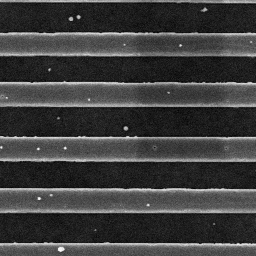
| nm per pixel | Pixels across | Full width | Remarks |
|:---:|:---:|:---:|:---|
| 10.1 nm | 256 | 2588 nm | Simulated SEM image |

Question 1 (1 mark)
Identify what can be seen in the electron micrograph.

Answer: lines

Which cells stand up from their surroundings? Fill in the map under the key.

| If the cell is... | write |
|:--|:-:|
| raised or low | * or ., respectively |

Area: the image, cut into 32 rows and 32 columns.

................................
................................
................................
................................
********************************
********************************
********************************
................................
................................
................................
********************************
********************************
********************************
................................
................................
................................
................................
********************************
********************************
********************************
................................
................................
................................
................................
********************************
********************************
................................
................................
................................
................................
**************************.*.**.
********************************